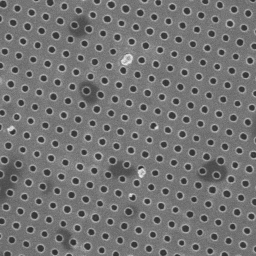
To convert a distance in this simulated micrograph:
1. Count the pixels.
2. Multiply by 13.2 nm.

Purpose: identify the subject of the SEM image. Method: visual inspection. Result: a regular array of holes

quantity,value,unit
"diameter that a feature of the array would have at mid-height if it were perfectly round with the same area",86.9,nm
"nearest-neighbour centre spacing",14.7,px